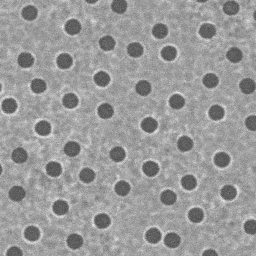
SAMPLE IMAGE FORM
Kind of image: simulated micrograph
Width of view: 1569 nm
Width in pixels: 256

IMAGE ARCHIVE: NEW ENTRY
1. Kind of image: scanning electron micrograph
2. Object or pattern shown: a regular array of holes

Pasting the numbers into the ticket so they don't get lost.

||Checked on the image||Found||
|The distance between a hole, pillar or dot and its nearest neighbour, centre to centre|207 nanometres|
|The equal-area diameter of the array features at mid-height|0.107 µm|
